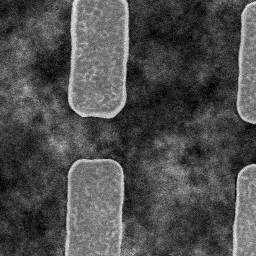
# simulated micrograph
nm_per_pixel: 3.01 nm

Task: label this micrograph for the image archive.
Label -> raised bodies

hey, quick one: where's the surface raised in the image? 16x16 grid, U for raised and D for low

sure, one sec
DDDDDUUUDDDDDDDU
DDDDDUUUDDDDDDDU
DDDDDUUUDDDDDDDU
DDDDDUUUDDDDDDDU
DDDDUUUUDDDDDDDU
DDDDUUUUDDDDDDDU
DDDDUUUUDDDDDDDU
DDDDDDDDDDDDDDDU
DDDDDDDDDDDDDDDD
DDDDDDDDDDDDDDDD
DDDDDUUDDDDDDDDU
DDDDUUUUDDDDDDDU
DDDDUUUUDDDDDDDU
DDDDUUUUDDDDDDDU
DDDDUUUUDDDDDDDU
DDDDUUUUDDDDDDDU